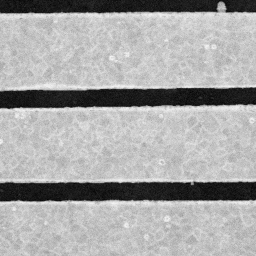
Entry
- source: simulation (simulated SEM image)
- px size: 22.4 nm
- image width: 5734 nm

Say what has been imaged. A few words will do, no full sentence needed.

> lines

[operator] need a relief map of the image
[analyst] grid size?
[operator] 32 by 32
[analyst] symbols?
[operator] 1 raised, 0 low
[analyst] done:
00000000000000000000000000000000
00000000000000000000000000000000
11111111111111111111111111111111
11111111111111111111111111111111
11111111111111111111111111111111
11111111111111111111111111111111
11111111111111111111111111111111
11111111111111111111111111111111
11111111111111111111111111111111
11111111111111111111111111111111
11111111111111111111111111111111
00000000000000000000000000000000
00000000000000000000000000000000
00000000000111111111111111111111
11111111111111111111111111111111
11111111111111111111111111111111
11111111111111111111111111111111
11111111111111111111111111111111
11111111111111111111111111111111
11111111111111111111111111111111
11111111111111111111111111111111
11111111111111111111111111111111
11111111111111111111111111111111
00000000000000000000000000000000
00000000000000000000000000000000
11111111111111111111111111111111
11111111111111111111111111111111
11111111111111111111111111111111
11111111111111111111111111111111
11111111111111111111111111111111
11111111111111111111111111111111
11111111111111111111111111111111